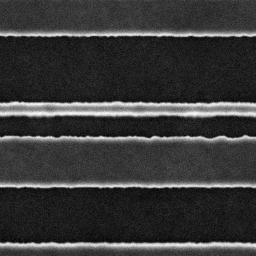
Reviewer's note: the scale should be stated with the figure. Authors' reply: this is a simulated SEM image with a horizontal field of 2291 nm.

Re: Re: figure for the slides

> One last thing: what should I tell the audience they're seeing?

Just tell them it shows lines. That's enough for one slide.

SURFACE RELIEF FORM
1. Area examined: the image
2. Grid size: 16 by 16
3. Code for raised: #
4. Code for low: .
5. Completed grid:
################
################
................
................
................
................
##.....##.......
################
################
################
################
################
................
................
................
################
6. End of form